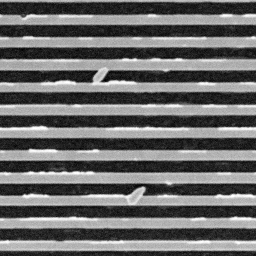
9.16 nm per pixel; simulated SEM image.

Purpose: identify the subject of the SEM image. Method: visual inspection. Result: parallel lines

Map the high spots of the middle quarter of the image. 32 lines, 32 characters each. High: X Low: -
XXXXXXXXXXXXXXXXXXXXXXXXXXXXXXXX
-XX-----XXXXX--XXXXX--XXXXXXXXXX
--------XX----------------------
-------XXX----------------------
XX-----XXX-XXXXX----------------
XXXXXXXXXXXXXXXXXXXXXXXXXXXXXXXX
XXXXXXXXXXXXXXXXXXXXXXXXXXXXXXXX
--------------------------------
--------------------------------
--------------------------------
XXXXXXXXXXXXXXXXXXXXXXXXXXXXXXXX
XXXXXXXXXXXXXXXXXXXXXXXXXXXXXXXX
XXXXXXXXXXXXXXXXXXXXXXXXXXXXXXXX
--------------------------------
--------------------------------
--------------------------------
XXXXXXXXXXXXXXXXXXXXXXXXXXXXXXXX
XXXXXXXXXXXXXXXXXXXXXXXXXXXXXXXX
--------------------------------
--------------------------------
--------------------------------
--------------------------------
XXXXXXXXXXXXXXXXXXXXXXXXXXXXXXXX
XXXXXXXXXXXXXXXXXXXXXXXXXXXXXXXX
--------------------------------
--------------------------------
--------------------------------
XXXXXXXXXXXXXXXXXXXXXXXXXXXXXXXX
XXXXXXXXXXXXXXXXXXXXXXXXXXXXXXXX
XXXXXXXXXXXXXXXXXXXXXXXXXXXXXXXX
--------------------------------
------------------XX------------